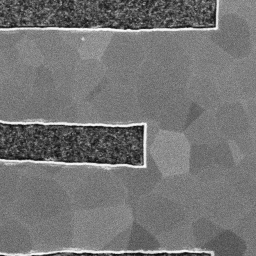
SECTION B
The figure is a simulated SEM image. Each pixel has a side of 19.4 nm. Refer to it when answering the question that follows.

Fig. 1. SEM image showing one or a few lines or trenches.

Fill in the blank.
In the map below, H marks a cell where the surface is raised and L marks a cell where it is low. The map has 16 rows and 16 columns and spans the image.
LLLLLLLLLLLLLHHH
LLLLLLLLLLLLLHHH
HHHHHHHHHHHHHHHH
HHHHHHHHHHHHHHHH
HHHHHHHHHHHHHHHH
HHHHHHHHHHHHHHHH
HHHHHHHHHHHHHHHH
HHHHHHHHHHHHHHHH
LLLLLLLLLHHHHHHH
LLLLLLLLLHHHHHHH
HHHHHHHHHHHHHHHH
HHHHHHHHHHHHHHHH
HHHHHHHHLHHHHHHH
HHHHHHHHHHHHHHHH
HHHHHHHHHHHHHHHH
HHHHHHHHHHHHHHHH